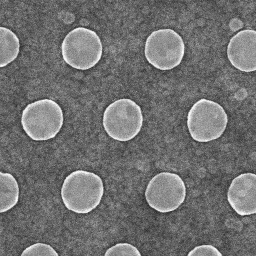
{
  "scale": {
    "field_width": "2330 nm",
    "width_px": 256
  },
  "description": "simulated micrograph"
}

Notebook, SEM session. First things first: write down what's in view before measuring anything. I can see raised bodies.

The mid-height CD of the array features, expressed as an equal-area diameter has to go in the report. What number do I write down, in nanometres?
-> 365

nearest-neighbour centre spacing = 746 nm